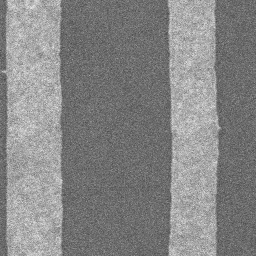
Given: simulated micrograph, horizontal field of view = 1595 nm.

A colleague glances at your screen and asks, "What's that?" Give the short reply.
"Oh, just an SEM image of one or a few lines or trenches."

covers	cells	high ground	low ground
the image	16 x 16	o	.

oooo.......oo...
oooo.......oo...
oooo.......oo...
oooo.......oo...
oooo.......oo...
oooo.......oo...
oooo.......oo...
oooo.......ooo..
oooo.......ooo..
oooo.......ooo..
oooo.......ooo..
oooo.......ooo..
oooo.......oo...
oooo.......oo...
oooo.......ooo..
oooo.......oo...